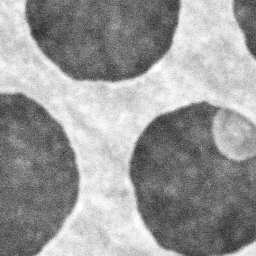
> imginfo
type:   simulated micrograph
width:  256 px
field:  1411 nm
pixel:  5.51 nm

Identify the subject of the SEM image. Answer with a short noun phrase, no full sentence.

holes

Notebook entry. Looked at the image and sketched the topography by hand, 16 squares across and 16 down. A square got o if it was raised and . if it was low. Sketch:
oo.........oooo.
oo.........oooo.
oo.........oooo.
ooo.......oooooo
oooo.....ooooooo
oooooooooooooooo
..oooooooooo.ooo
....oooooo......
....ooooo.......
.....ooo........
.....ooo........
.....ooo........
.....ooo........
.....oooo.......
....ooooo.......
...ooooooo.....o